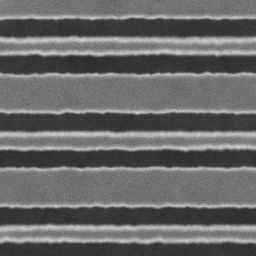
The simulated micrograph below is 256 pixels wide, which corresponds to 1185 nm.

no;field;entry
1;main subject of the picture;lines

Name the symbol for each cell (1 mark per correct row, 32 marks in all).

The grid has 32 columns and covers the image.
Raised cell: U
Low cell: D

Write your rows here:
UUUUUUUUUUUUUUUUUUUUUUUUUUUUUUUU
UUUUUUUUUUUUUUUUUUUUUUUUUUUUUUUU
DDDDDDDDDDDDDDDDDDDDDDDDDDDDDDDD
DDDDDDDDDDDDDDDDDDDDDDDDDDDDDDDD
DDDDDDDDDDDDDDDDDDDDDDDDDDDDDDDD
UUUUUUUUUUUUUUUUUUUUUUUUUUUUUUUU
UUUUUUUUUUUUUUUUUUUUUUUUUUUUUUUU
DDDDDDDDDDDDDDDDDDDDDDDDDDDDDDDD
DDDDDDDDDDDDDDDDDDDDDDDDDDDDDDDD
UUUUUUUUUUUUUUUUUUUUUUUUUUUUUUUU
UUUUUUUUUUUUUUUUUUUUUUUUUUUUUUUU
UUUUUUUUUUUUUUUUUUUUUUUUUUUUUUUU
UUUUUUUUUUUUUUUUUUUUUUUUUUUUUUUU
UUUUUUUUUUUUUUUUUUUUUUUUUUUUUUUU
DDDDDDDDDDDDDDDDDDDDDDDDDDDDDDDD
DDDDDDDDDDDDDDDDDDDDDDDDDDDDDDDD
DDDDDUUDDUUDUUDDDDDDDUUDDDDDDDDD
UUUUUUUUUUUUUUUUUUUUUUUUUUUUUUUU
UUUUUUUUUUUUUUUUUUUUUUUUUUUUUUUU
DDDDDDDDDDDDDDDDDDDDDDDDDDDDDDDD
DDDDDDDDDDDDDDDDDDDDDDDDDDDDDDDD
UUUUUUUUUUUUUUUUUUUUUUUUUUUUUUUU
UUUUUUUUUUUUUUUUUUUUUUUUUUUUUUUU
UUUUUUUUUUUUUUUUUUUUUUUUUUUUUUUU
UUUUUUUUUUUUUUUUUUUUUUUUUUUUUUUU
UUUUUUUUUUUUUUUUUUUUUUUUUUUUUUUU
DDDDDDDDDDDDDDDDDDDDDDDDDDDDDDDD
DDDDDDDDDDDDDDDDDDDDDDDDDDDDDDDD
UUUUUUUUUUUUUUUUUUUUUUUUUUUUUUUU
UUUUUUUUUUUUUUUUUUUUUUUUUUUUUUUU
DDDDDDDDDDDDDDDDDDDDDDDDDDDDDDDD
DDDDDDDDDDDDDDDDDDDDDDDDDDDDDDDD